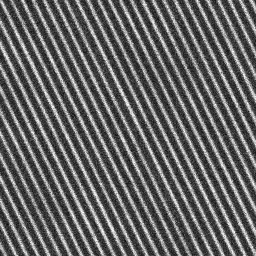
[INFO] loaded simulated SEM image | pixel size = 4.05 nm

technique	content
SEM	parallel lines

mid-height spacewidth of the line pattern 6.86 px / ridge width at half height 10.5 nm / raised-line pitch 9.8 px